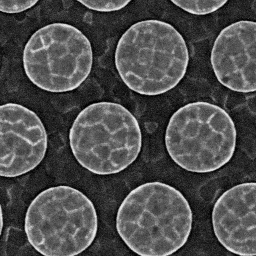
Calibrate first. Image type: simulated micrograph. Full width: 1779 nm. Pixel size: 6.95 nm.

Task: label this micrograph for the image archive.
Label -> raised bodies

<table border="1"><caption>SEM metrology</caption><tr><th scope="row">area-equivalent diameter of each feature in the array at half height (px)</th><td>70.1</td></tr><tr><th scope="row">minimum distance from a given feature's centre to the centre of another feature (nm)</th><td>648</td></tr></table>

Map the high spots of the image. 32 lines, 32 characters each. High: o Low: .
oooo......oooooo......oooooo....
.o......................oo......
................................
.....oooo.......oooooo......oooo
....ooooooo....oooooooo....ooooo
...oooooooo....oooooooo....ooooo
...oooooooo....oooooooo...oooooo
...oooooooo...ooooooooo...oooooo
...oooooooo....oooooooo....ooooo
....ooooooo....oooooooo....ooooo
....oooooo......oooooo......oooo
.................ooo............
................................
ooo........oooo........oooo.....
ooooo.....ooooooo.....ooooooo...
ooooo....oooooooo....oooooooo...
oooooo...oooooooo....oooooooo...
oooooo...oooooooo....oooooooo...
oooooo...oooooooo....oooooooo...
ooooo....oooooooo....oooooooo...
ooooo.....oooooo......oooooo....
ooo.........oo..................
................................
.......oo........ooooo.......ooo
.....oooooo.....ooooooo.....oooo
....ooooooo....oooooooo....ooooo
....oooooooo...ooooooooo...ooooo
...ooooooooo...ooooooooo...ooooo
...ooooooooo...ooooooooo...ooooo
....oooooooo...ooooooooo...ooooo
....ooooooo.....ooooooo.....oooo
.....ooooo.......ooooo.......ooo